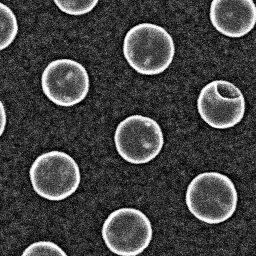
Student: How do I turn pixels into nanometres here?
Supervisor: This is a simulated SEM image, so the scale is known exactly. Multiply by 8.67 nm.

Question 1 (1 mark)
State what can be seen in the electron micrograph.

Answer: raised bodies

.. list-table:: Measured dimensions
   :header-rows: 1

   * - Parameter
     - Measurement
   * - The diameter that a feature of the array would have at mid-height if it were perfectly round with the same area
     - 405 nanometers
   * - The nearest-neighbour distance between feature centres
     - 0.778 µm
